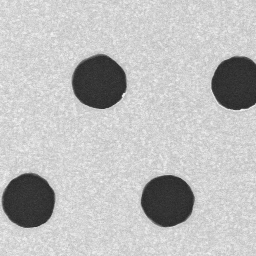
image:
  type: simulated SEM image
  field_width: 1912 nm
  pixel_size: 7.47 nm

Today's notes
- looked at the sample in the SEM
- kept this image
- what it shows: holes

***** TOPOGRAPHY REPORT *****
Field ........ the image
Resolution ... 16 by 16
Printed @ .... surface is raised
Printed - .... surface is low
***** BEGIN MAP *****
@@@@@@@@@@@@@@@@
@@@@@@@@@@@@@@@@
@@@@@@@@@@@@@@@@
@@@@@@-@@@@@@@@@
@@@@@---@@@@@---
@@@@@---@@@@@---
@@@@@--@@@@@@@--
@@@@@@@@@@@@@@@@
@@@@@@@@@@@@@@@@
@@@@@@@@@@@@@@@@
@@@@@@@@@@@@@@@@
@--@@@@@@---@@@@
---@@@@@@---@@@@
---@@@@@@---@@@@
@@@@@@@@@@@@@@@@
@@@@@@@@@@@@@@@@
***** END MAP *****